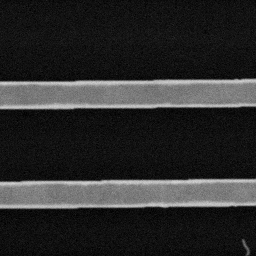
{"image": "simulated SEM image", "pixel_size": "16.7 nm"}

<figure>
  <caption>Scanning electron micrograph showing lines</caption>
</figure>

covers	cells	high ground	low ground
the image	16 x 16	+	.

................
................
................
................
................
++++++++++++++++
++++++++++++++++
................
................
................
................
++++++++++++++++
++++++++++++++++
................
................
................